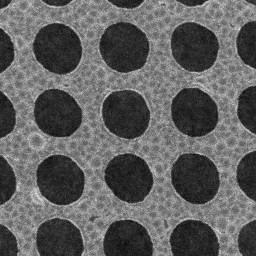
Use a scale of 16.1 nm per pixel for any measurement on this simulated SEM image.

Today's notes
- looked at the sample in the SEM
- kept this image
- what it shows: a regular array of holes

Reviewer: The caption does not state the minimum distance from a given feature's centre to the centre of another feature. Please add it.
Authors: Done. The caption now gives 1050 nanometres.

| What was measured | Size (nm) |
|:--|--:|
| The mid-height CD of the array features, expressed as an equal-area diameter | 808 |